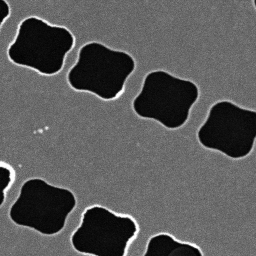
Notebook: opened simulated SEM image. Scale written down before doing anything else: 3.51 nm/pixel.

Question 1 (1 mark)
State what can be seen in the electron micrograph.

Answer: holes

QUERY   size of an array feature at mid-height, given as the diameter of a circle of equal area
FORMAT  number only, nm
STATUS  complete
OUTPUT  196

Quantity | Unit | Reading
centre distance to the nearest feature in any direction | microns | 0.238